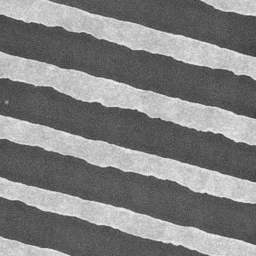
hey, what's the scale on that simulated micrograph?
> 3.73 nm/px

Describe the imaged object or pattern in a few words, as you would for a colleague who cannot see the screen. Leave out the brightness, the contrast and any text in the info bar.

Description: lines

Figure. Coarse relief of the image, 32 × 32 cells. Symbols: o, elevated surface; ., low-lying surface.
ooooooo...................oooooo
ooooooooooo..................ooo
..ooooooooooooo.................
........ooooooooooo.............
............ooooooooooo.........
...............ooooooooooo......
...................oooooooooo...
oooo..................oooooooooo
ooooooo...................oooooo
ooooooooooo....................o
....oooooooooooo................
.......oooooooooooo.............
..........ooooooooooooo.........
...............oooooooooooo.....
...................ooooooooooo..
oooo..................oooooooooo
oooooooo..................oooooo
.oooooooooo..................ooo
.....oooooooooo.................
.........ooooooooooo............
...........oooooooooooo.........
................ooooooooooo.....
o....................oooooooooo.
ooooo...................oooooooo
ooooooooo..................ooooo
...oooooooooo...................
......ooooooooooo...............
...........ooooooooo............
..............oooooooooo........
.................oooooooooo.....
ooo...................ooooooooo.
ooooooo..................ooooooo